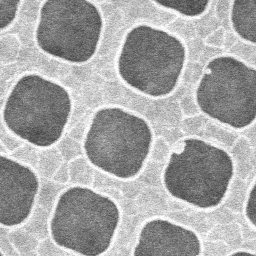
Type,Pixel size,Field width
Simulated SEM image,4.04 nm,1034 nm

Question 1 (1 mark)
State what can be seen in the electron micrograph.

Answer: holes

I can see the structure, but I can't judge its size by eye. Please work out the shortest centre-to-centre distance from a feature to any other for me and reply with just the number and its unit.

349 nanometers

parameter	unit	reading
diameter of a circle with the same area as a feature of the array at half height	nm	289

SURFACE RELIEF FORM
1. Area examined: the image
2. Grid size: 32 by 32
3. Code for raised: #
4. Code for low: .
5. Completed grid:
...##.......#######.......###...
..###........########.....###...
..###........################...
.###.........###....#########...
####.........##.......########..
####........###........########.
#####.......###........#########
#######....###.........###....##
##############.........###......
###..##########........##.......
##......########......###.......
#........########.....##........
#........###############........
.........###...##########.......
.........##.......########......
........###........#########...#
#.......###........#############
###....###.........###...#######
#####.####.........###......####
.##########........##........###
...########.......###........###
....#########.....##.........###
.....##########.####.........###
.....###...##########........##.
.....##.......#######.......###.
....###........########.....###.
....###........###############..
...###.........###...##########.
######.........###......########
######........###........#######
#######.......###........#######
#########....####........####..#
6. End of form